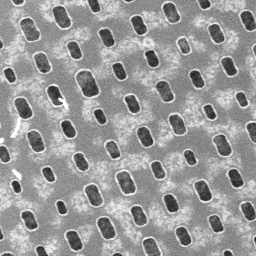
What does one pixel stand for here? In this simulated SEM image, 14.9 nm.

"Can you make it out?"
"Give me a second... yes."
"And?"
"a regular array of holes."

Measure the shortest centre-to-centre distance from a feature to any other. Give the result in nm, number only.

514